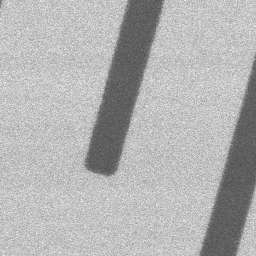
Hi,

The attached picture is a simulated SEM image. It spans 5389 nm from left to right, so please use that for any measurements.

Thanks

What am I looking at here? one or a few lines or trenches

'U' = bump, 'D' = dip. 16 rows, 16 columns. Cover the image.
DDDDDDDDUUDDDDDD
DDDDDDDDUUDDDDDD
DDDDDDDUUUDDDDDD
DDDDDDDUUDDDDDDD
DDDDDDDUUDDDDDDD
DDDDDDUUUDDDDDDU
DDDDDDUUDDDDDDDU
DDDDDDUUDDDDDDDU
DDDDDDUUDDDDDDDU
DDDDDUUUDDDDDDUU
DDDDDUUDDDDDDDUU
DDDDDDDDDDDDDDUU
DDDDDDDDDDDDDUUU
DDDDDDDDDDDDDUUU
DDDDDDDDDDDDDUUD
DDDDDDDDDDDDDUUD